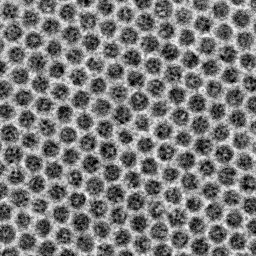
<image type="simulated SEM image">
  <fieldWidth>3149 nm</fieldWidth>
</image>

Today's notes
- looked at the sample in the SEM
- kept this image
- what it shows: a regular array of raised bodies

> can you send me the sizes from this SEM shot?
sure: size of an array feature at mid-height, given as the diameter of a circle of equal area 14.4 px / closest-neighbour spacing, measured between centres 264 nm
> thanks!